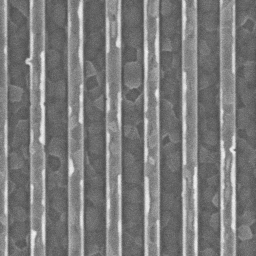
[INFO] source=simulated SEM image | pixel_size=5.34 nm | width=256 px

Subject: parallel lines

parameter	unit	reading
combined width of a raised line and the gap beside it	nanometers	203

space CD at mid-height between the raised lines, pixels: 23.4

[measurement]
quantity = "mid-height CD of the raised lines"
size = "74.7 nm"